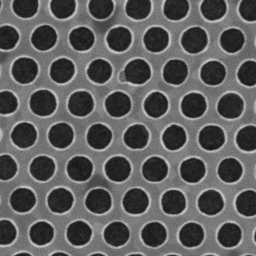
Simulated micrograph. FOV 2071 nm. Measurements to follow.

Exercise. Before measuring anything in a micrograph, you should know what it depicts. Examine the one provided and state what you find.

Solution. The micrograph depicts a regular array of holes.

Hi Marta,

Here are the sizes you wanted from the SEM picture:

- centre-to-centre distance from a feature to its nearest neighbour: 300 nanometres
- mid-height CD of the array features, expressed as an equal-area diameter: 0.215 microns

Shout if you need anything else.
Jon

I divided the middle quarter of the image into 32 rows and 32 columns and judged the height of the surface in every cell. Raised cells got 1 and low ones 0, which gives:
00011100000011100000011110000001
00011100000011100000001110000001
00011100000011000000001110000001
00111100000011000000001110000001
01111110000111000000011110000011
11111111111111111111111111111111
11110111111111111111111111111111
11000001111000001111100001111110
10000001111000000111000000111100
10000000110000000111000000111000
10000000110000000111000000111000
10000001111000000111000000111000
11000011111000001111100001111100
11111111111110111111111111111110
11111111111111111111111111111111
00111110000111111000111111000111
00111100000011110000011110000011
00011000000011100000011110000001
00011000000011100000011100000001
00111100000011100000011110000001
01111110000111110000011110000011
11111111011111111111111111001111
11111111111111111111111111111111
11000011111000001111100011111110
10000001111000001111000000111100
10000001110000000111000000111000
10000001110000000110000000111000
10000001110000000111000000111000
11000011111000001111000001111000
11101111111110011111110111111110
11111111111111111111111111111111
01111110001111110000111111000111